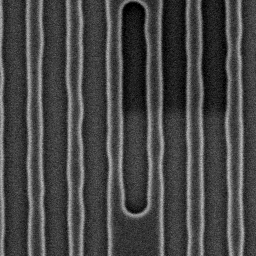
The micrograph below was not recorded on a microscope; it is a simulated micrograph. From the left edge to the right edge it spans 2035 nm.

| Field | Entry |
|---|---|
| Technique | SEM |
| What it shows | groups of lines, slits or small figures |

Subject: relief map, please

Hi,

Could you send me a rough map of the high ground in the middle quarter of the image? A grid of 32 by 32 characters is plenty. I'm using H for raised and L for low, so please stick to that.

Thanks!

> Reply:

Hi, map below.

LHHHLLLLLLLHHHLLLLLLLHHHLLLLLLLH
LHHHLLLLLLLHHHLLLLLLLHHHLLLLLLLH
LHHHLLLLLLLHHHLLLLLLLHHHLLLLLLLH
LHHHLLLLLLLHHHLLLLLLLHHHLLLLLLLH
LHHHLLLLLLLHHHLLLLLLLHHHLLLLLLLH
LHHHLLLLLLLHHHLLLLLLLHHHLLLLLLLH
LHHHLLLLLLLHHHLLLLLLLHHHLLLLLLLH
LHHHLLLLLLLHHHLLLLLLLHHHLLLLLLLH
LHHHLLLLLLLHHHLLLLLLLHHHLLLLLLLH
LHHHLLLLLLLHHHLLLLLLLHHHLLLLLLLH
LHHHLLLLLLLHHHLLLLLLLHHHLLLLLLLH
LHHHHLLLLLLHHHLLLLLLLHHHLLLLLLLH
LHHHLLLLLLLHHHLLLLLLLHHHLLLLLLLH
LHHHLLLLLLLHHHLLLLLLLHHHLLLLLLLH
LHHHLLLLLLLHHHLLLLLLLHHHLLLLLLLH
LHHHLLLLLLLHHHLLLLLLLHHHLLLLLLLH
LHHHLLLLLLLHHHLLLLLLLHHHLLLLLLLH
LHHHLLLLLLLHHHLLLLLLLHHHHLLLLLLH
LHHHLLLLLLLHHHLLLLLLLHHHHLLLLLLH
LHHHLLLLLLLHHHLLLLLLLHHHHLLLLLLH
LHHHLLLLLLLHHHLLLLLLLHHHHLLLLLLH
LHHHLLLLLLLHHHLLLLLLLHHHHLLLLLLH
LHHHLLLLLLLHHHLLLLLLLHHHHLLLLLLH
LHHHLLLLLLLHHHLLLLLLLHHHHLLLLLLH
LHHHLLLLLLLHHHLLLLLLLHHHLLLLLLLH
LHHHHLLLLLLHHHLLLLLLLHHHLLLLLLLH
LHHHHLLLLLLHHHLLLLLLLHHHLLLLLLLH
LHHHHLLLLLLHHHLLLLLLLHHHLLLLLLLH
LHHHHLLLLLLHHHLLLLLLLHHHHLLLLLLH
LHHHHLLLLLLHHHHLLLLLLHHHHLLLLLLH
LHHHLLLLLLLHHHHLLLLLLHHHHLLLLLLH
LHHHLLLLLLLHHHHLLLLLLHHHHLLLLLLH